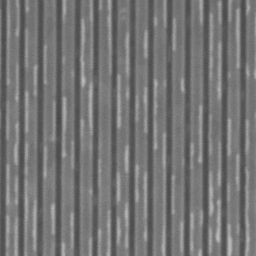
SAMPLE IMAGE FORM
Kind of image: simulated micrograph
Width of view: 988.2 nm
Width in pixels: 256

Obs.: parallel lines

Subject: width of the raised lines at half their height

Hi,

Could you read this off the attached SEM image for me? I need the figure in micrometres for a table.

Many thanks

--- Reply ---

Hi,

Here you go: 0.0478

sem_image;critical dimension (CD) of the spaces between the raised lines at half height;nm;24.1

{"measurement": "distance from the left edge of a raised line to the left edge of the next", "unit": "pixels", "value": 18.4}